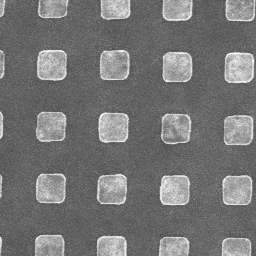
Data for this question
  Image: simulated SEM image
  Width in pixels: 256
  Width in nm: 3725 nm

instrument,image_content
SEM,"a regular array of raised bodies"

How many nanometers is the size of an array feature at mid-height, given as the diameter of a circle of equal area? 462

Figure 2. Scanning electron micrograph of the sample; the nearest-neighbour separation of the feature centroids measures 893 nm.